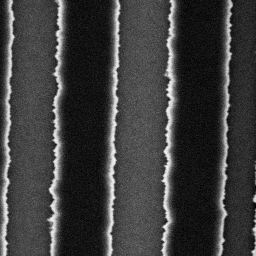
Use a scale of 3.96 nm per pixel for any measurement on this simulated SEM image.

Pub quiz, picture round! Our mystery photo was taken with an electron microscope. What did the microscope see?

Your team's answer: lines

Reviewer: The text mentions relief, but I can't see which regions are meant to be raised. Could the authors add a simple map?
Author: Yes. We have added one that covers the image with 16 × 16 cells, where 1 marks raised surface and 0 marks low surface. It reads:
1000111000011100
1000111000011100
1000111000011100
1000111000011100
1000111000011100
1000111000011100
1001111000011100
1001111000111100
1001111000111100
1001111000111100
1001111000111100
0001111000111100
0001111000111100
0001111000111100
0001111000111100
0001111000111100